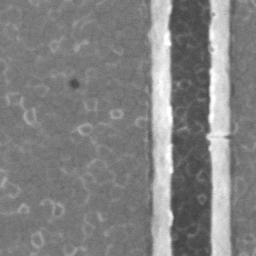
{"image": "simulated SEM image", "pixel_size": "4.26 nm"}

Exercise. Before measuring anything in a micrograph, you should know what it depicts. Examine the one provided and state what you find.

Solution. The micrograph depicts one or a few lines or trenches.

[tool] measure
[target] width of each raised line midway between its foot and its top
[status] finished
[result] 254 nm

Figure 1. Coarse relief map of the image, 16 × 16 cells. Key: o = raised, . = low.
..........oooo..
..........oooo..
..........oooo..
..........oooo..
..........oooo..
..........oooo..
..........oooo..
..........oooo..
..........oooo..
..........oooo..
..........oooo..
..........oooo..
..........oooo..
..........oooo..
..........oooo..
..........oooo..